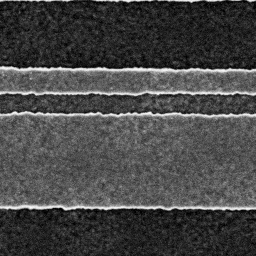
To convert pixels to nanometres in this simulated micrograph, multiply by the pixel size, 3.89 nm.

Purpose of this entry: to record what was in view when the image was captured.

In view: lines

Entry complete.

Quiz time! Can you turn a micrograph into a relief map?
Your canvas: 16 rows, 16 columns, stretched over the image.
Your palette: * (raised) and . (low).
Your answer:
................
................
................
................
****************
****************
****************
****************
****************
****************
****************
****************
****************
................
................
................